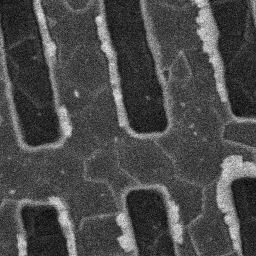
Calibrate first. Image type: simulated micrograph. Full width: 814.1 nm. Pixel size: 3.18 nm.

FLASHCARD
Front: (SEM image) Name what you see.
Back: holes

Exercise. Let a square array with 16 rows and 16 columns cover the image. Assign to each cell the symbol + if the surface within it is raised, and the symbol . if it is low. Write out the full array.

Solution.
..++++...++++...
..+++++..++++...
...++++..+++++..
...++++...++++..
...++++...++++..
+..++++...++++..
+...++++..++++..
+...++++...+++++
+...++++++++++++
++++++++++++++++
++++++++++++++++
+++++++++++++++.
++++++++..+++++.
+...++++...++++.
+...++++...++++.
++..++++...++++.